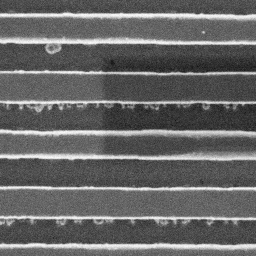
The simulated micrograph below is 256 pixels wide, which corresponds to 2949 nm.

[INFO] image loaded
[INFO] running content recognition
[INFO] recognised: lines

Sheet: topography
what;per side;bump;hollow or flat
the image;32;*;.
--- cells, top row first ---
................................
................................
********************************
********************************
********************************
................................
................................
................................
................................
********************************
********************************
********************************
********************************
................................
................................
................................
**................**............
********************************
********************************
********************************
................................
................................
................................
.****...........................
********************************
********************************
********************************
................................
................................
................................
................................
********************************